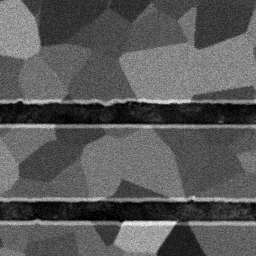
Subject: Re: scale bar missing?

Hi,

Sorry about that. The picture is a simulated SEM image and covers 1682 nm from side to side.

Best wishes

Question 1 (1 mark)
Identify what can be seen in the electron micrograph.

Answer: one or a few lines or trenches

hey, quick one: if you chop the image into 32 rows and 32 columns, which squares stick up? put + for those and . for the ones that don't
++++++++++++++++++++++++++++++++
++++++++++++++++++++++++++++++++
++++++++++++++++++++++++++++++++
++++++++++++++++++++++++++++++++
++++++++++++++++++++++++++++++++
++++++++++++++++++++++++++++++++
++++++++++++++++++++++++++++++++
++++++++++++++++++++++++++++++++
++++++++++++++++++++++++++++++++
++++++++++++++++++++++++++++++++
++++++++++++++++++++++++++++++++
++++++++++++++++++++++++++++++++
++++++++++++++++++++++++++++++++
................................
................................
................................
++++++++++++++++++++++++++++++++
++++++++++++++++++++++++++++++++
++++++++++++++++++++++++++++++++
++++++++++++++++++++++++++++++++
++++++++++++++++++++++++++++++++
++++++++++++++++++++++++++++++++
++++++++++++++++++++++++++++++++
++++++++++++++++++++++++++++++++
++++++++++++++++++++++++++++++++
................................
................................
................................
++++++++++++++++++++++++++++++++
++++++++++++++++++++++++++++++++
++++++++++++++++++++++++++++++++
++++++++++++++++++++++++++++++++